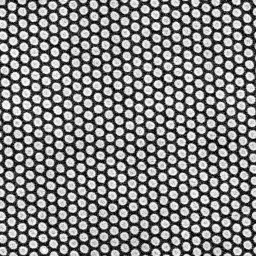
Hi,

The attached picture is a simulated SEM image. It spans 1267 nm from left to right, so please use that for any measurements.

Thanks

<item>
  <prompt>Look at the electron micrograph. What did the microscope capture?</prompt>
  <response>a regular array of raised bodies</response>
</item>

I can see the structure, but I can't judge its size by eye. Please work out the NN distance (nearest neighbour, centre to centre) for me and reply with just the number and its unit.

56.2 nm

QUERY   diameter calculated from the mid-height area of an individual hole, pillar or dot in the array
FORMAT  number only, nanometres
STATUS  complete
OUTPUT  39.1